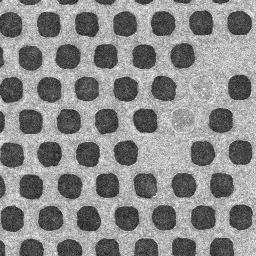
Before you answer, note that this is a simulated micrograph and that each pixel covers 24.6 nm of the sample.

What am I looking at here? a regular array of holes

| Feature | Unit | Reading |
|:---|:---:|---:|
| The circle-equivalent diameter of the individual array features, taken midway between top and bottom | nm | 633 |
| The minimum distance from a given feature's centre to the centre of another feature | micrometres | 0.913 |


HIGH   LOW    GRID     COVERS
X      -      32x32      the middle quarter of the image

---XXXXX-----XXXXX----XXXXXX----
XXXXXXXXXXXXXXXXXXXXXXXXXXXXXXXX
XXXXXXXXXXXXXXXXXXXXXXXXXXXXXXXX
XXXX---XXXXXX----XXXXXX----XXXXX
XXX------XXXX-----XXXX------XXXX
XX-------XXX-------XXX------XXXX
XXX------XXX-------XXX------XXXX
XXX------XXX-------XXX------XXXX
XXX-----XXXXX-----XXXXX-----XXXX
XXXXXXXXXXXXXXXXXXXXXXXXXXXXXXXX
XXXXXXXXXXXXXXXXXXXXXXXXXXXXXXXX
---XXXXXX---XXXXXXX---XXXXXXXXXX
----XXXX-----XXXX------XXXXXXXXX
----XXXX------XXX------XXXXXXXXX
----XXXX------XXX------XXXXXXXXX
----XXXX------XXXX-----XXXXXXXXX
----XXXX-----XXXXX-----XXXXXXXXX
--XXXXXXX-XXXXXXXXXXXXXXXXXXXXXX
XXXXXXXXXXXXXXXXXXXXXXXXXXXXXXXX
XXXXXX-XXXXXXX---XXXXXXXXXXXXXXX
XXXX-----XXXX-----XXXXXXXXXXXXXX
XXX------XXX-------XXXXXXXXXXXXX
XXX------XXX-------XXXXXXXXXXXXX
XXX------XXXX-----XXXXXXXXXXXXXX
XXX------XXXX-----XXXXXXXXXXXXXX
XXXXX---XXXXXXXX-XXXXXXXXXXXXXXX
XXXXXXXXXXXXXXXXXXXXXXXXXXXXXXXX
--XXXXXXX----XXXXX----XXXXXX---X
----XXXX-----XXXX------XXXX-----
-----XXX------XXX------XXXX-----
-----XXX------XXX------XXXX-----
----XXXX------XXXX------XXX-----